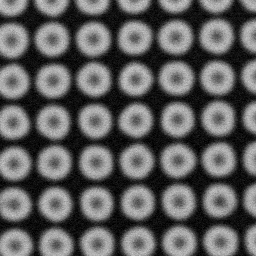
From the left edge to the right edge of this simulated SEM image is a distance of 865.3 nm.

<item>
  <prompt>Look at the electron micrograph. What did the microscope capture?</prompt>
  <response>an array of small figures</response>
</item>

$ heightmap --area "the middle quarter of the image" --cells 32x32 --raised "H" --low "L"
LLLLLHHHHHLLLLLLHHHHLLLLLHHHHHHL
HLLLHHHHHHHLLLLHHHHHHLLLHHHHHHHH
HLLHHHHHHHHLLLHHHHHHHHLLHHHHHHHH
HHLHHHHHHHHLLLHHHHHHHHLLHHHHHHHH
HHLHHHHHHHHLLLHHHHHHHHLLHHHHHHHH
HLLLHHHHHHHLLLHHHHHHHHLLHHHHHHHH
HLLLHHHHHHHLLLLHHHHHHLLLLHHHHHHL
LLLLLLHHHHLLLLLLHHHHLLLLLLLHHHLL
LLLLLLLLLLLLLLLLLLLLLLLLLLLLLLLL
LLLLLLLLLLLLLLLLLLLLLLLLLLLLLLLL
LLLLLLHHHLLLLLLLHHHHLLLLLLHHHHHL
LLLLLHHHHHHLLLLHHHHHHLLLLHHHHHHH
HLLLHHHHHHHLLLHHHHHHHHLLLHHHHHHH
HLLLHHHHHHHHLLHHHHHHHHLLHHHHHHHH
HLLLHHHHHHHHLLHHHHHHHHLLHHHHHHHH
HLLLHHHHHHHHLLHHHHHHHHLLLHHHHHHH
HLLLLHHHHHHLLLHHHHHHHLLLLHHHHHHH
LLLLLHHHHHHLLLLLHHHHLLLLLLHHHHLL
LLLLLLLHHLLLLLLLLLLLLLLLLLLLLLLL
LLLLLLLLLLLLLLLLLLLLLLLLLLLLLLLL
LLLLLLLLLLLLLLLLLHHHLLLLLLLHHHLL
LLLLLHHHHHHLLLLHHHHHHLLLLHHHHHHH
HLLLHHHHHHHHLLHHHHHHHHLLHHHHHHHH
HHLLHHHHHHHHLLHHHHHHHHLLHHHHHHHH
HHLLHHHHHHHHLLHHHHHHHHLLHHHHHHHH
HHLLHHHHHHHHLLHHHHHHHHLLHHHHHHHH
HLLLHHHHHHHHLLLHHHHHHHLLLHHHHHHH
HLLLLHHHHHHLLLLHHHHHHLLLLLHHHHHL
LLLLLLHHHHLLLLLLLHHHLLLLLLLLLLLL
LLLLLLLLLLLLLLLLLLLLLLLLLLLLLLLL
LLLLLLLLLLLLLLLLLLHLLLLLLLLHHHLL
LLLLLLHHHHLLLLLLHHHHHLLLLLHHHHHH